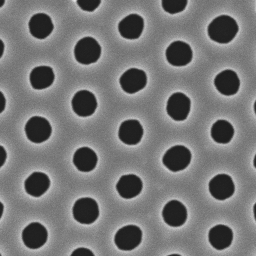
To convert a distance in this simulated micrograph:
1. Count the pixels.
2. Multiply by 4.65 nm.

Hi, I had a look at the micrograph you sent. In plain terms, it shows a regular array of holes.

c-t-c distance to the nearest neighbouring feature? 234 nm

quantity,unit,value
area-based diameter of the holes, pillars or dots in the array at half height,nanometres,123